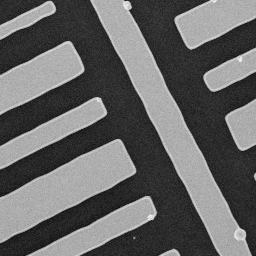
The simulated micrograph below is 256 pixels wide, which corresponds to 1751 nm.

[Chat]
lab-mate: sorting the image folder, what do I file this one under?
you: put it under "groups of lines, slits or small figures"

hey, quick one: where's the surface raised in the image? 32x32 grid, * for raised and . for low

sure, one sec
......*.....****..........******
....***.....****.......*********
.****........****.....*********.
***..........****.....*******...
*.............****.....****.....
........*.....****.....**.......
......****.....****............*
....******.....****..........***
..********......****.......*****
**********......****......*****.
********.........****.....***...
******...........****...........
****.......*......****..........
**........***.....****........**
........*****......****.....****
.....******........****.....****
....*****...........****.....***
..*****.............****.....***
*****.......****.....****.....*.
***.......******.....****.......
*.......*********.....****......
.......**********.....****......
....***********........****.....
...***********.........****.....
.***********............****....
**********......***.....****....
*******.......*****......****...
*****.......*******......****...
****.......******.........****..
**......*******...........*****.
......*******..............****.
....*******..........*.....****.